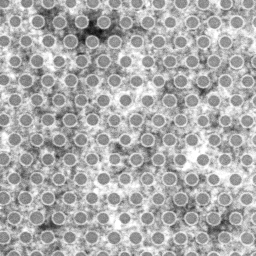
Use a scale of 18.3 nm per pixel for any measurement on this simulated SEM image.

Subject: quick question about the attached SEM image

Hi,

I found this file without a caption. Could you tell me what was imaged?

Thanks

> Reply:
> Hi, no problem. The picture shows a regular array of raised bodies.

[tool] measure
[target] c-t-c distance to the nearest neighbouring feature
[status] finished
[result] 403 nm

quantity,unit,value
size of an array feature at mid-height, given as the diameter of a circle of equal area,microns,0.241